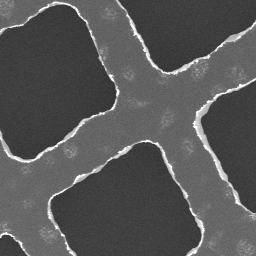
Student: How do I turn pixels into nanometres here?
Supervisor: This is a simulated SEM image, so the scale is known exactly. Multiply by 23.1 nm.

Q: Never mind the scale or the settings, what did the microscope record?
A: holes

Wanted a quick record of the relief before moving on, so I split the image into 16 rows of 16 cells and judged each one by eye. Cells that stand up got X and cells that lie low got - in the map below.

XXX-XXXX--------
X----XXX--------
------XXX-----XX
------XXX----XXX
-------XXXXXXXXX
-------XXXXXXXX-
-------XXXXXX---
-----XXXXXXX----
----XXXXXXXXX---
X--XXXXX--XXX---
XXXXXX----XXXX--
XXXXX------XXX--
XXX---------XXX-
XXX---------XXXX
XXXX---------XXX
-XXX--------XXXX